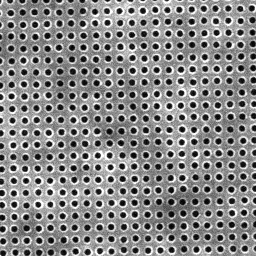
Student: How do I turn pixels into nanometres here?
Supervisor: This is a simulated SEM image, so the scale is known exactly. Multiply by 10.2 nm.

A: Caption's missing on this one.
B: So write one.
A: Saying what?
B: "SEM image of a regular array of holes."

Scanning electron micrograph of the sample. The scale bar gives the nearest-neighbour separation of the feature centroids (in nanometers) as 118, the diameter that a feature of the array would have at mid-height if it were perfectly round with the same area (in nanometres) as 69.8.